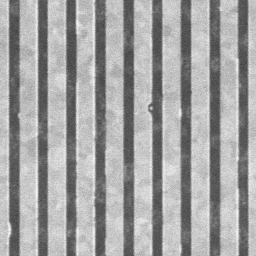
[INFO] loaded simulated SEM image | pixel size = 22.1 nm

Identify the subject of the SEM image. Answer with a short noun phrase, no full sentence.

parallel lines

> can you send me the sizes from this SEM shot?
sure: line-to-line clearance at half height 254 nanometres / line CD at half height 370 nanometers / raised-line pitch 633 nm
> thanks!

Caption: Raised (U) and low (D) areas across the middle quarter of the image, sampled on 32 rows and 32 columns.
DDDUUUUDDDDUUUUDDDUUUUDDDUUUUDDD
DDDUUUUDDDDUUUUDDDUUUUDDDUUUUDDD
DDDUUUUDDDDUUUUDDDUUUUDDDUUUUDDD
DDDUUUUDDDDUUUUDDDUUUUDDDUUUUDDD
DDDUUUUDDDDUUUUDDDUUUUDDDUUUUDDD
DDDUUUUDDDDUUUUDDDUUUUDDDUUUUDDD
DDDUUUUDDDDUUUUDDDUUUUDDDUUUUDDD
DDDUUUUDDDDUUUUDDDUUUUDDDUUUUDDD
DDDUUUUDDDDUUUUDDDUUUUDDDUUUUDDD
DDDUUUUDDDDUUUUDDDUUUUDDDUUUUDDD
DDDUUUUDDDDUUUUDDDUUUDDDDUUUUDDD
DDDUUUUDDDDUUUUDDDUUUDDDDUUUUDDD
DDDUUUUDDDDUUUUDDDUUUDDDDUUUUDDD
DDDUUUUDDDDUUUUDDDUUUUDDDUUUUDDD
DDDUUUUDDDDUUUUDDDUUUUDDDUUUUDDD
DDDUUUUDDDDUUUUDDDUUUUDDDUUUUDDD
DDDUUUUDDDDUUUUDDDUUUUDDDUUUUDDD
DDDUUUUDDDDUUUUDDDUUUUDDDUUUUDDD
DDDUUUUDDDDUUUUDDDUUUUDDDUUUUDDD
DDDUUUUDDDDUUUUDDDUUUUDDDUUUUDDD
DDDUUUUDDDDUUUUDDDUUUUDDDUUUUDDD
DDDUUUUDDDDUUUUDDDUUUUDDDUUUUDDD
DDDUUUUDDDDUUUUDDDUUUUDDDUUUUDDD
DDDUUUUDDDDUUUUDDDUUUUDDDUUUUDDD
DDDUUUUDDDDUUUUDDDUUUUDDDUUUUDDD
DDDUUUUDDDDUUUUDDDUUUUDDDUUUUDDD
DDDUUUUDDDDUUUUDDDUUUUDDDUUUUDDD
DDDUUUUDDDDUUUUDDDUUUUDDDUUUUDDD
DDDUUUUDDDDUUUUDDDUUUUDDDUUUUDDD
DDDUUUUDDDDUUUUDDDUUUUDDDUUUUDDD
DDDUUUUDDDDUUUUDDDUUUUDDDUUUUDDD
DDDUUUUDDDDUUUUDDDUUUUDDDUUUUDDD